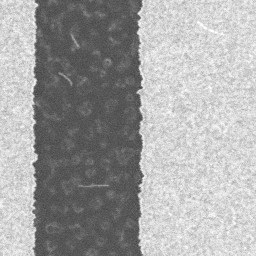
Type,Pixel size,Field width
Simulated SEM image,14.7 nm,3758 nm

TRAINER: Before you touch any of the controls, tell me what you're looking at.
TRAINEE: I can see one or a few lines or trenches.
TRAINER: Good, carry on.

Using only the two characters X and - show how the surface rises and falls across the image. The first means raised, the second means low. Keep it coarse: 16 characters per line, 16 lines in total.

XX-------XXXXXXX
XX-------XXXXXXX
XX-------XXXXXXX
XX-------XXXXXXX
XX-------XXXXXXX
XX-------XXXXXXX
XX-------XXXXXXX
XX-------XXXXXXX
XX-------XXXXXXX
XX-------XXXXXXX
XX-------XXXXXXX
XX-------XXXXXXX
XX-------XXXXXXX
XX-------XXXXXXX
XX-------XXXXXXX
XX-------XXXXXXX